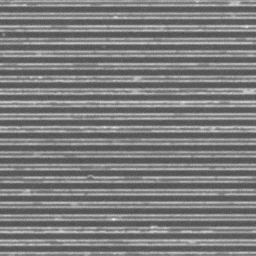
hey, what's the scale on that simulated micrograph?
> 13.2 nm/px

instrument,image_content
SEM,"parallel lines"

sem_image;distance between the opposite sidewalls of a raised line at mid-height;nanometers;67.5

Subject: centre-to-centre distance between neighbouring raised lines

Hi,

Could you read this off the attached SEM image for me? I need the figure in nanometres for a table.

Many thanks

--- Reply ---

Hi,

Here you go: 166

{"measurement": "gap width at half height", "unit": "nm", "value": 98.7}